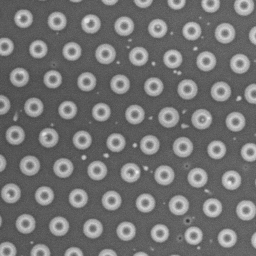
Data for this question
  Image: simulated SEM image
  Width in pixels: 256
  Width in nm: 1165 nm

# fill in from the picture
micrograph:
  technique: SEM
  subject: an array of small figures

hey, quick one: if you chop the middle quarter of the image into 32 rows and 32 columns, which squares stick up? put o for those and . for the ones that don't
..........................ooo...
................................
....ooo.........................
....oooo....oooo......o.........
...ooooo....oooo....oooo.....ooo
....oooo....oooo....ooooo....ooo
.....oo.....oooo....ooooo....ooo
.....................ooo.....ooo
..............................oo
oo..............................
ooo.....ooo......oo.............
ooo....oooo.....oooo....oooo....
ooo....ooooo...ooooo....ooooo...
oo......ooo.....oooo....ooooo...
................ooo.....oooo....
.........................oo.....
................................
...ooo......o...................
..ooooo....oooo.....ooo......oo.
..ooooo....oooo....ooooo....oooo
...ooo.....oooo....ooooo...ooooo
............oo.....oooo....ooooo
.....................o......oooo
................................
oo.....oo.......................
oo....oooo.....ooo......o.......
oo....ooooo...ooooo....oooo.....
oo....ooooo...ooooo....oooo....o
.......ooo.....oooo....oooo....o
................o......oooo....o
................................
...oo...........................